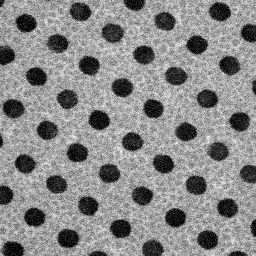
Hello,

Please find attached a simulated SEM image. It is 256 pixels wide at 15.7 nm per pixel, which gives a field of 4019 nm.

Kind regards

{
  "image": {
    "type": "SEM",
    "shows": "a regular array of holes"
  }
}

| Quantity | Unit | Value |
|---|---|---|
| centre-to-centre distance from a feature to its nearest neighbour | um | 0.599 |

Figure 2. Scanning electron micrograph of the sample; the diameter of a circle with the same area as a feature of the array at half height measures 335 nm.